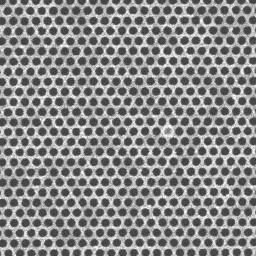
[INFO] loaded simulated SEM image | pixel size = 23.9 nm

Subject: a regular array of holes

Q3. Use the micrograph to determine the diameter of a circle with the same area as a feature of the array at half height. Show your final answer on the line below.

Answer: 0.213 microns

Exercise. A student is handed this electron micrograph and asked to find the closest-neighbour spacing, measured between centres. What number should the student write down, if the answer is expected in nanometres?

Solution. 269